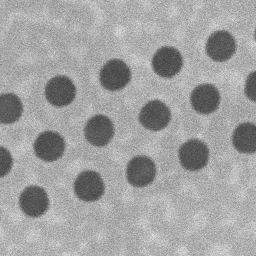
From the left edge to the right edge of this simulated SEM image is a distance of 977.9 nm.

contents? a regular array of holes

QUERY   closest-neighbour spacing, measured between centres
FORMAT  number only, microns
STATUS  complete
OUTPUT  0.205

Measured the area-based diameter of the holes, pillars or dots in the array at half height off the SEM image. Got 32.8 pixels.